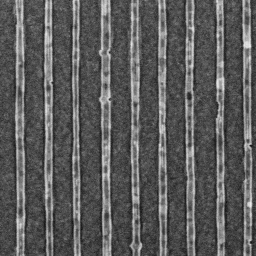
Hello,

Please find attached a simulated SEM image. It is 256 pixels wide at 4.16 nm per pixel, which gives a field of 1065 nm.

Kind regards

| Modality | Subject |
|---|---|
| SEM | parallel lines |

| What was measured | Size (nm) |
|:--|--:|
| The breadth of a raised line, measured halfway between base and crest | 23.9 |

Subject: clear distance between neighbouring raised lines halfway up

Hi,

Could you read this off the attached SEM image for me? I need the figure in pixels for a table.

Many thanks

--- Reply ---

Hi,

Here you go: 22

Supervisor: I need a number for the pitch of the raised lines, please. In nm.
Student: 118